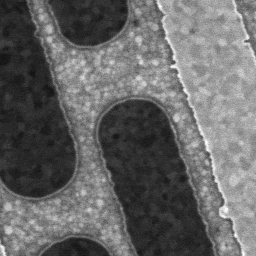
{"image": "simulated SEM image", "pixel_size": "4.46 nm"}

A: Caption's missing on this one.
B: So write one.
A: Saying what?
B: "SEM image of one or a few lines or trenches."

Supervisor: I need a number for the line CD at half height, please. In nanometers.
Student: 336